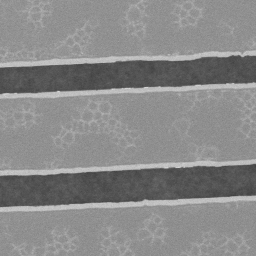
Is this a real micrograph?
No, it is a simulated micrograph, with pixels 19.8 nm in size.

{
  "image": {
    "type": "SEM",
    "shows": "one or a few lines or trenches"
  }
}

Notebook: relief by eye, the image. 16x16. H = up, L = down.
HHHHHHHHHHHHHHHH
HHHHHHHHHHHHHHHH
HHHHHHHHHHHHHHHH
HHHHHHHHHHHHLLLL
LLLLLLLLLLLLLLLL
LLLLLLLLLLLLHHHH
HHHHHHHHHHHHHHHH
HHHHHHHHHHHHHHHH
HHHHHHHHHHHHHHHH
HHHHHHHHHHHHHHHH
HHHHHHHHLLLLLLLL
LLLLLLLLLLLLLLLL
LLLLLLLLLLLLLHHH
HHHHHHHHHHHHHHHH
HHHHHHHHHHHHHHHH
HHHHHHHHHHHHHHHH